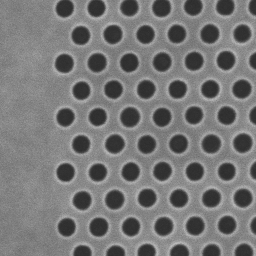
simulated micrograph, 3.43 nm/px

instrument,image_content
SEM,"a regular array of holes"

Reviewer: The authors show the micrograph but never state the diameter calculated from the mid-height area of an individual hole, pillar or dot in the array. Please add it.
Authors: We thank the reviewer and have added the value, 61.6 nanometers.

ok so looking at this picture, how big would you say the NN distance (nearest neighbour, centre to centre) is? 107 nm